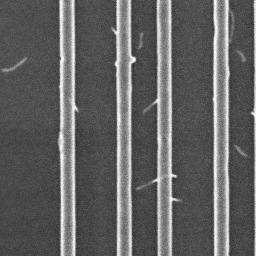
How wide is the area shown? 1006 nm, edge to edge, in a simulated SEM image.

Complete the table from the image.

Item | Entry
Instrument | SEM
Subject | parallel lines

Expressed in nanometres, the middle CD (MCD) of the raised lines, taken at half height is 52.1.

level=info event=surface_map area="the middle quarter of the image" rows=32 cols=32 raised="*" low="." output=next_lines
**...........****.......***.....
**............***.......***.....
**...........****.......***.....
**...........****.......***.....
**............***.......***.....
**............***.......***.....
**............***.......***.....
**............***.......***.....
**............***.......***.....
**............***......****.....
***...........***.......***.....
***...........***.......***.....
**............***.......***.....
**............***.......***.....
**............***.......***.....
**............**........***.....
**............**........***.....
**............**........***.....
**............**........***.....
***...........**........***.....
***...........**........***.....
***...........**........***.....
***...........**........***.....
***...........**........***.....
***...........***.......***.....
***...........***.......***.....
**............***.......***.....
**............***.......***.....
***...........***......****.....
***...........***......****.....
***...........**........***.....
***...........**........***.....